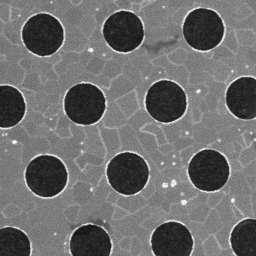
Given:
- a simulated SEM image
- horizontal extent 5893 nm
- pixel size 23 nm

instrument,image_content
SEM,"a regular array of holes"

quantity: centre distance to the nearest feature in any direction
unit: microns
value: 1.86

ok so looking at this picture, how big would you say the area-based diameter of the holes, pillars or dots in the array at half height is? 970 nm